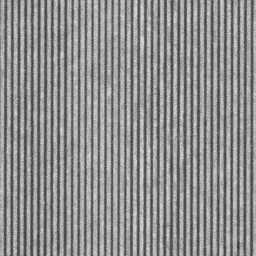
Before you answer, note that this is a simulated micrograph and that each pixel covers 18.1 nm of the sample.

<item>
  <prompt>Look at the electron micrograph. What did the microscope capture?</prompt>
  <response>parallel lines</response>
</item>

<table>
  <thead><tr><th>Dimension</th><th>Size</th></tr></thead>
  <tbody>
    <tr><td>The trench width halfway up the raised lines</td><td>67.9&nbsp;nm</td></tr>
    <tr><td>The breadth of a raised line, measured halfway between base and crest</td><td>54.3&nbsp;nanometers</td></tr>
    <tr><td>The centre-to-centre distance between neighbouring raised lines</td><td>0.12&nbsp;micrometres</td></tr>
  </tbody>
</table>